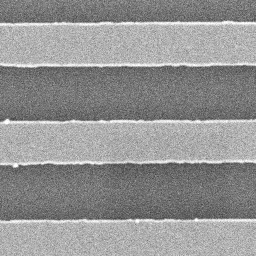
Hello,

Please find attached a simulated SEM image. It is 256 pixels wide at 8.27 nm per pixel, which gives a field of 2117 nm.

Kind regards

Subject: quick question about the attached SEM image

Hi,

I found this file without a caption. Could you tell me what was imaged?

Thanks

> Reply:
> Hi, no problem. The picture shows lines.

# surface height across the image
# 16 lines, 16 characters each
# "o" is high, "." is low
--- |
................
oooooooooooooooo
oooooooooooooooo
oooooooooooooooo
................
................
................
...............o
oooooooooooooooo
oooooooooooooooo
................
................
................
................
oooooooooooooooo
oooooooooooooooo